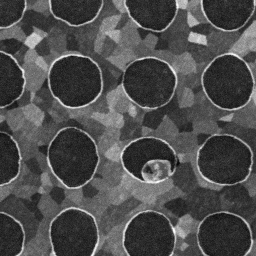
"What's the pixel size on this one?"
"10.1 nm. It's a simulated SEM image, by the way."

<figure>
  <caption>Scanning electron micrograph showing holes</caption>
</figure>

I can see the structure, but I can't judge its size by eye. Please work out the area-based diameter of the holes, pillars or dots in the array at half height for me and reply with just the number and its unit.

527 nanometres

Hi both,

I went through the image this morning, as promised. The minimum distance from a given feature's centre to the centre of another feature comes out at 745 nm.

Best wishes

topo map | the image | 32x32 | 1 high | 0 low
00011100000001110000001110000000
00011110000011110000001110000000
00111111000111111000001111000001
11111111111111111100011111100011
11111111111111111111111111111111
11111111111111111111111111111111
11111111111111111111111111111111
00111110000111111000111111100011
00011100000011110000011111000001
00011100000001110000001110000001
00011100000001100000001110000000
00011100000001110000001111000000
00111110000011111000011111000001
11111111111111111111111111110011
11111111111111111111111111111111
11111111111111111111111111111111
11111110001111111111111111111111
00111110000011111000111111000011
00111100000011110000011110000001
00011100000011100000001110000001
00111100000011100011101110000001
00111110000011110011111110000001
00111111000111111111111111000001
11111111111111111111111111111111
11111111111111111111111111111111
11111111111111111111111111111111
11111111000111111100111111111111
00111110000011110000011111000011
00011100000011110000001110000001
00011100000011110000001110000001
00011100000011100000001110000001
00011110000011110000001110000001